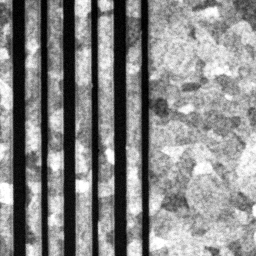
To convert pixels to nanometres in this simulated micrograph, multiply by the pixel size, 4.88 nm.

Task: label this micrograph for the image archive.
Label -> parallel lines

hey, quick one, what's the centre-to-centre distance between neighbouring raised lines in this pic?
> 0.123 µm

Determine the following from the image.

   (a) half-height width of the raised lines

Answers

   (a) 71.3 nm